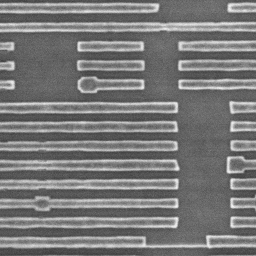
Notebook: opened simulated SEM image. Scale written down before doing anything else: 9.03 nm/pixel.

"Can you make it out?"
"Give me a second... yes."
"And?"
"wiring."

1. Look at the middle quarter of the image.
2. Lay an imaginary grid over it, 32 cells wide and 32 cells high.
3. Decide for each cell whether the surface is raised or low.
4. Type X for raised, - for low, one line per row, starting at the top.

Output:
---XXXXXXXXXXXXXXXXX---------XXX
--------------------------------
--------------------------------
----XXXX------------------------
----XXXXXXXXXXXXXXXX---------XXX
----XXXXXXXXXXXXXXXX---------XXX
----XXXXX-----------------------
--------------------------------
--------------------------------
--------------------------------
XXXXXXXXXXXXXXXXXXXXXXXXXXXX----
XXXXXXXXXXXXXXXXXXXXXXXXXXXX----
--------------------------------
--------------------------------
-XXXXX---XXXXX------XXXXXXXX----
XXXXXXXXXXXXXXXXXXXXXXXXXXXX----
XXXXXXXXXXXXXXXXXXXXXXXXXXXX----
--------------------------------
--------------------------------
-----XXXX---XXXXXXXX---XXXX-----
XXXXXXXXXXXXXXXXXXXXXXXXXXXX----
----------XXX-------------------
--------------------------------
--------------------------------
XXXXXXXXXXXXXXXXXXXXXXXXXXXX----
XXXXXXXXXXXXXXXXXXXXXXXXXXXX----
------------XXXX----------------
--------------------------------
--------------------------------
XXXXXXXXXXXXXXXXXXXXXXXXXXXX----
XXXXXXXXXXXXXXXXXXXXXXXXXXXX----
--------------------------------